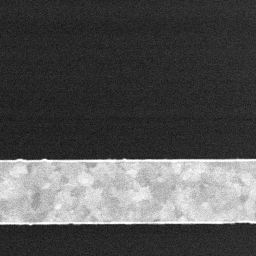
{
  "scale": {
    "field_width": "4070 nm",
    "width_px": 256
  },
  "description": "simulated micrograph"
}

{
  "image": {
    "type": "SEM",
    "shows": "one or a few lines or trenches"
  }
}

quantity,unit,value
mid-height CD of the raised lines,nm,996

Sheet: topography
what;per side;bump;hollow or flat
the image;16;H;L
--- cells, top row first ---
LLLLLLLLLLLLLLLL
LLLLLLLLLLLLLLLL
LLLLLLLLLLLLLLLL
LLLLLLLLLLLLLLLL
LLLLLLLLLLLLLLLL
LLLLLLLLLLLLLLLL
LLLLLLLLLLLLLLLL
LLLLLLLLLLLLLLLL
LLLLLLLLLLLLLLLL
LLLLLLLLLLLLLLLL
HHHHHHHHHHHHHHHH
HHHHHHHHHHHHHHHH
HHHHHHHHHHHHHHHH
HHHHHHHHHHHHHHHH
LLLLLLLLLLLLLLLL
LLLLLLLLLLLLLLLL